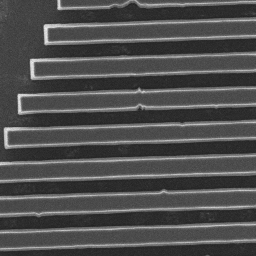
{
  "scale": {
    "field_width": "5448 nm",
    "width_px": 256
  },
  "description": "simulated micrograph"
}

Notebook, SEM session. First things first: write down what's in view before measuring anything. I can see parallel lines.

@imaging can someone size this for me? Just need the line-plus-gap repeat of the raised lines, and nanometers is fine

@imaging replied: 724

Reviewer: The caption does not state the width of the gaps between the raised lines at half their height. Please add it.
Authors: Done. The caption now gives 338 nm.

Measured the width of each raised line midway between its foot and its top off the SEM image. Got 375 nm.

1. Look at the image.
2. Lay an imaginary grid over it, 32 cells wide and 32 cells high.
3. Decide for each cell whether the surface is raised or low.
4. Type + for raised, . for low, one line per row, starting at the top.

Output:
.......+++++++++.+++++++........
................................
..............................++
......++++++++++++++++++++++++++
......++++++++++++++++++++++++++
................................
................................
.....+++++++++++++++++++++++++++
....++++++++++++++++++++++++++++
....++++++++....................
................................
..............++++++++++++++++++
..++++++++++++++++++++++++++++++
...++++++++++++++...+...........
................................
.......................+++++++++
.+++++++++++++++++++++++++++++++
.+++++++++++++++++++++++++......
................................
............................++++
.+++++++++++++++++++++++++++++++
++++++++++++++++++++++++++++++++
+++++...........................
................................
.......+++++++++++++++++++++++++
++++++++++++++++++++++++++++++++
+++++++++++++...................
................................
................++++++++++++++++
++++++++++++++++++++++++++++++++
+++++++++++++++++++.............
................................